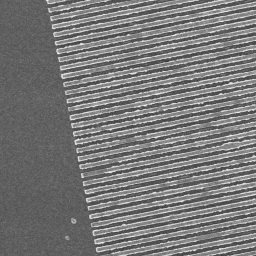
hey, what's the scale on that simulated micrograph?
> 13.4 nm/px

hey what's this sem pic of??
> parallel lines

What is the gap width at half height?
49.2 nm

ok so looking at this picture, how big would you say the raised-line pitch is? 8.42 pixels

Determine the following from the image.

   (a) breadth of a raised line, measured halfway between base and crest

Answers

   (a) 62.4 nm